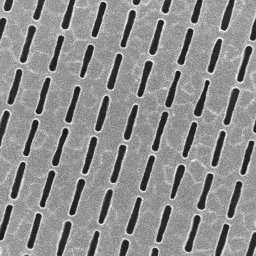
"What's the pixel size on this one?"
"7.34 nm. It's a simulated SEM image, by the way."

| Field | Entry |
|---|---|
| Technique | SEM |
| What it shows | a regular array of holes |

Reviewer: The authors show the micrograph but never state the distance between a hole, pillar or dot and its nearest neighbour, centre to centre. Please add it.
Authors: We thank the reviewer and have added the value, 0.223 um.